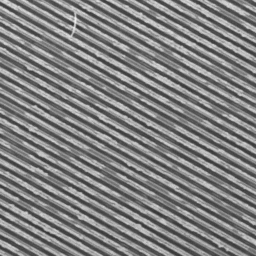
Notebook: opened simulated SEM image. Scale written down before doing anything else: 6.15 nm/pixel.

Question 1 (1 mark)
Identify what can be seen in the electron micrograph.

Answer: parallel lines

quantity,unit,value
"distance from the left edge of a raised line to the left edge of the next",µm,0.0544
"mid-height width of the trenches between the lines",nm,28.2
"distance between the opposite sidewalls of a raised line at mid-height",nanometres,24.2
